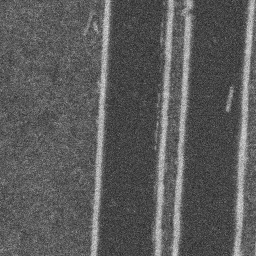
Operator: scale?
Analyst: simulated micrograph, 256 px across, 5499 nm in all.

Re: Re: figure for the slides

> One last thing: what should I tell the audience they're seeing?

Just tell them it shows one or a few lines or trenches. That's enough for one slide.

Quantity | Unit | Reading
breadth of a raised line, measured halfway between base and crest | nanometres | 392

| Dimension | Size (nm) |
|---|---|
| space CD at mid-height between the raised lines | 1330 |